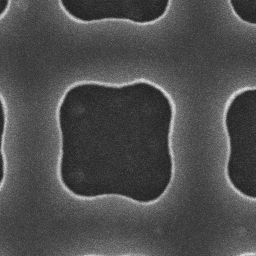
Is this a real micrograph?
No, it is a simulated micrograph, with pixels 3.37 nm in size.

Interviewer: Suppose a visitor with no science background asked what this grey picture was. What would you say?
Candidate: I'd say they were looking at holes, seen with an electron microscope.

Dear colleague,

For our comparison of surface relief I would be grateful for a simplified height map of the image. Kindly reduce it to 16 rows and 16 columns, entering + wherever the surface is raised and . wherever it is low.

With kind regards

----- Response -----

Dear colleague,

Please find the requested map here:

++++......+++++.
++++++++++++++++
++++++++++++++++
++++++++++++++++
++++++++++++++++
+++++.....++++++
++++.......+++..
++++.......+++..
++++.......+++..
++++.......+++..
++++.......+++..
++++.......++++.
++++++++..++++++
++++++++++++++++
++++++++++++++++
++++++++++++++++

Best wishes